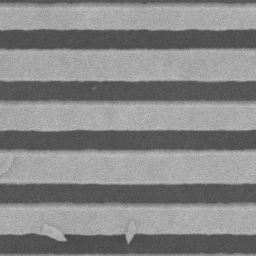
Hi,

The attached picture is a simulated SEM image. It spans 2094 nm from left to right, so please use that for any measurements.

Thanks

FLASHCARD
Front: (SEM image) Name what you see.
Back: lines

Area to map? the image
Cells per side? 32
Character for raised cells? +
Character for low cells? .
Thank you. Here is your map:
................................
++++++++++++++++++++++++++++++++
++++++++++++++++++++++++++++++++
++++++++++++++++++++++++++++++++
................................
................................
++++++++++++++++++++++++++++++++
++++++++++++++++++++++++++++++++
++++++++++++++++++++++++++++++++
++++++++++++++++++++++++++++++++
................................
................................
................................
++++++++++++++++++++++++++++++++
++++++++++++++++++++++++++++++++
++++++++++++++++++++++++++++++++
................................
................................
................................
++++++++++++++++++++++++++++++++
++++++++++++++++++++++++++++++++
++++++++++++++++++++++++++++++++
++++++++++++++++++++++++++++++++
................................
................................
................................
++++++++++++++++++++++++++++++++
++++++++++++++++++++++++++++++++
++++++++++++++++++++++++++++++++
......++........+...............
................................
................................